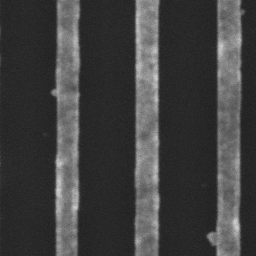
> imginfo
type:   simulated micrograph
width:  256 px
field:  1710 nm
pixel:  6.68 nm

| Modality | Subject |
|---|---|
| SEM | lines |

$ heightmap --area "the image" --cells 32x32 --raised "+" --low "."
.......+++.......+++.......+++..
.......+++.......+++.......+++..
.......+++.......+++.......+++..
.......+++.......+++.......+++..
.......+++.......+++.......+++..
.......+++.......+++.......+++..
.......+++.......+++.......+++..
.......+++.......+++.......+++..
.......+++.......+++.......+++..
.......+++.......+++.......+++..
.......+++.......+++.......+++..
.......+++.......+++.......+++..
.......+++.......+++.......+++..
.......+++.......+++.......+++..
.......+++.......+++.......+++..
.......+++.......+++.......+++..
.......+++.......+++.......+++..
.......+++.......+++.......+++..
.......+++.......+++.......+++..
.......+++.......+++.......+++..
.......+++.......+++.......+++..
.......+++.......+++.......+++..
.......+++.......+++.......+++..
.......+++.......+++.......+++..
.......+++.......+++.......+++..
.......+++.......+++.......+++..
.......+++.......+++.......+++..
.......+++.......+++.......+++..
.......+++.......+++.......+++..
.......+++.......+++.......+++..
.......+++.......+++.......+++..
.......+++.......+++.......+++..